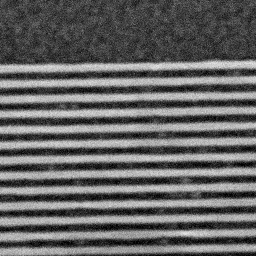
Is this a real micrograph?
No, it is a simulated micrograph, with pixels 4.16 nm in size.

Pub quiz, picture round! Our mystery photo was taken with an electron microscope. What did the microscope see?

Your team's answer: parallel lines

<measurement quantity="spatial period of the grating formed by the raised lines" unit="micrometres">0.0634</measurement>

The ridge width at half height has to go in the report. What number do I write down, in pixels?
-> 4.88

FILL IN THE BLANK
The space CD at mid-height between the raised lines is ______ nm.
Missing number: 45.2